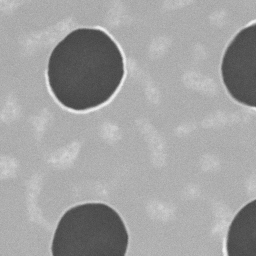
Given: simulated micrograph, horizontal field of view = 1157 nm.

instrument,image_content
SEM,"holes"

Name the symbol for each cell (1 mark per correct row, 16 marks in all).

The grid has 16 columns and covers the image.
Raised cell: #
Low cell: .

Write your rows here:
################
################
####...########.
###.....######..
###.....######..
###....#######..
####..#########.
################
################
################
################
################
################
####...########.
###.....######..
###.....######..